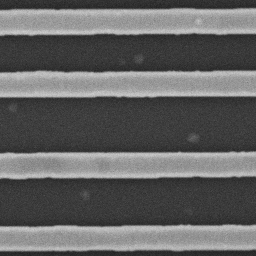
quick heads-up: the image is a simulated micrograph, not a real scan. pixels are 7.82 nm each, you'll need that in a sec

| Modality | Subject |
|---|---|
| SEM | lines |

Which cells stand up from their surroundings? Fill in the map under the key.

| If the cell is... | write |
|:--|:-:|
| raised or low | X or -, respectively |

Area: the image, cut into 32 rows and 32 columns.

--------------------------------
XXXXXXXXXXXXXXXXXXXXXXXXXXXXXXXX
XXXXXXXXXXXXXXXXXXXXXXXXXXXXXXXX
XXXXXXXXXXXXXXXXXXXXXXXXXXXXXXXX
--------------------------------
--------------------------------
--------------------------------
--------------------------------
--------------------------------
XXXXXXXXXXXXXXXXXXXXXXXXXXXXXXXX
XXXXXXXXXXXXXXXXXXXXXXXXXXXXXXXX
XXXXXXXXXXXXXXXXXXXXXXXXXXXXXXXX
--------------------------------
--------------------------------
--------------------------------
--------------------------------
--------------------------------
--------------------------------
--------------------------------
XXXXXXXXXXXXXXXXXXXXXXXXXXXXXXXX
XXXXXXXXXXXXXXXXXXXXXXXXXXXXXXXX
XXXXXXXXXXXXXXXXXXXXXXXXXXXXXXXX
--------------------------------
--------------------------------
--------------------------------
--------------------------------
--------------------------------
--------------------------------
XXXXXXXXXXXXXXXXXXXXXXXXXXXXXXXX
XXXXXXXXXXXXXXXXXXXXXXXXXXXXXXXX
XXXXXXXXXXXXXXXXXXXXXXXXXXXXXXXX
--------------------------------